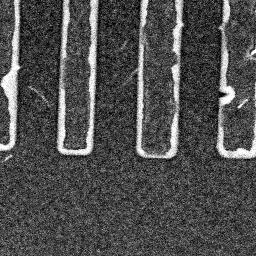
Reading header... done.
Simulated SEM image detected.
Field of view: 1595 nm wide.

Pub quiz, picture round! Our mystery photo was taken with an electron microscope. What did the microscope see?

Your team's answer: one or a few lines or trenches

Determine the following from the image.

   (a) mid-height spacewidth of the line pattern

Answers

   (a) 268 nm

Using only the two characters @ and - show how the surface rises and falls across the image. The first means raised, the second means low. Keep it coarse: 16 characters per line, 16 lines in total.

@---@@---@@---@@
@---@@---@@---@@
@---@@---@@---@@
@---@@---@@---@@
@---@@---@@---@@
@---@@---@@---@@
@---@@---@@---@@
@---@@---@@---@@
@---@@---@@---@@
----@----@@---@@
----------------
----------------
----------------
----------------
----------------
----------------